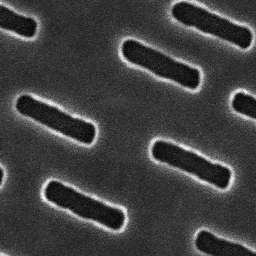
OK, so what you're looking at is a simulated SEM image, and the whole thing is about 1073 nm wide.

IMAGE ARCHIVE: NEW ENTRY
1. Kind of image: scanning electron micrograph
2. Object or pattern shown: holes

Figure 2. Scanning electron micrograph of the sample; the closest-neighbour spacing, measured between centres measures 0.379 microns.